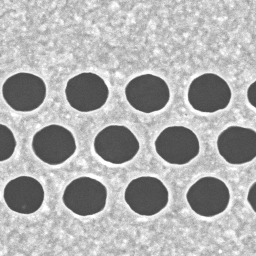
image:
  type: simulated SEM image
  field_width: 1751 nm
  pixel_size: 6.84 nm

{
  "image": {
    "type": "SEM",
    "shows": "a regular array of holes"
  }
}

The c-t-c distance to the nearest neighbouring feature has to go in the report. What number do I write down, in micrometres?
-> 0.408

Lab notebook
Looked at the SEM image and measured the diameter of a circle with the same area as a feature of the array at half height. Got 0.281 µm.